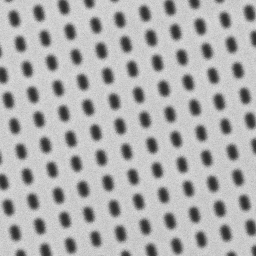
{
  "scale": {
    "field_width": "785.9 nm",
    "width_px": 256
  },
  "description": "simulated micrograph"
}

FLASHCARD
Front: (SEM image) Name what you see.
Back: a regular array of holes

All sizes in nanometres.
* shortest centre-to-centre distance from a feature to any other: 77.4